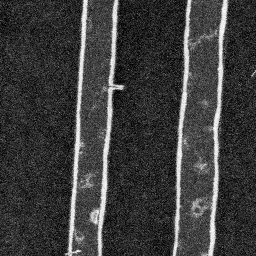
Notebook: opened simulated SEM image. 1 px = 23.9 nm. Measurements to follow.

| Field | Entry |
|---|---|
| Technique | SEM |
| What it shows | one or a few lines or trenches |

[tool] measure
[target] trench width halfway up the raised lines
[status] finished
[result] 1760 nanometres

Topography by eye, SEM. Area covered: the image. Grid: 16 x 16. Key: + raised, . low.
.....++.....++..
.....++.....++..
.....++.....++..
.....++.....++..
.....++.....++..
.....++.....++..
.....++....+++..
.....++....+++..
.....++....++...
.....++....+++..
.....++....+++..
.....++....++...
.....+.....++...
.....+.....++...
....++.....++...
....++.....++...